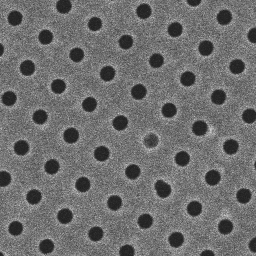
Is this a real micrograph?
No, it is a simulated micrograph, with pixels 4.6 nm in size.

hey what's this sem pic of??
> a regular array of holes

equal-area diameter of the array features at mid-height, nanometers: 70.4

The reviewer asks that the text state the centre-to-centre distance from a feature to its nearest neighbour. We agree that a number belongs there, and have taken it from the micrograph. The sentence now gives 164 nm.